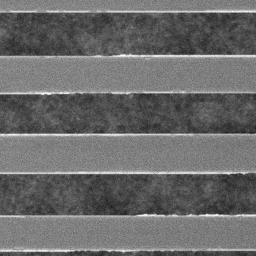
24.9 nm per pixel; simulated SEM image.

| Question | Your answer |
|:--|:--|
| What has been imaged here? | lines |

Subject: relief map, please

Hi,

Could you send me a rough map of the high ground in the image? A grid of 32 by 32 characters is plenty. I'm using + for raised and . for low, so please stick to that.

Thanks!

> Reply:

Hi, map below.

++++++++++++++++++++++++++++++++
................................
................................
................................
................................
................................
................................
++++++++++++++++++++++++++++++++
++++++++++++++++++++++++++++++++
++++++++++++++++++++++++++++++++
++++++++++++++++++++++++++++++++
++++++++++++++++++++++++++++++++
................................
................................
................................
................................
................................
++++++++++++++++++++++++++++++++
++++++++++++++++++++++++++++++++
++++++++++++++++++++++++++++++++
++++++++++++++++++++++++++++++++
++++++++++++++++++++++++++++++++
................................
................................
................................
................................
................................
++++++++++++++++++++++++++++++++
++++++++++++++++++++++++++++++++
++++++++++++++++++++++++++++++++
++++++++++++++++++++++++++++++++
................................